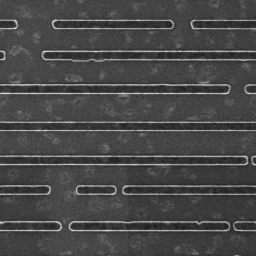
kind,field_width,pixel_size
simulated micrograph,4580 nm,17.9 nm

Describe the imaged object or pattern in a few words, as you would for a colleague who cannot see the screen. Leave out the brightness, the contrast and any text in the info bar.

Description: parallel lines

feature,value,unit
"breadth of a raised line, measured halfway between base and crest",156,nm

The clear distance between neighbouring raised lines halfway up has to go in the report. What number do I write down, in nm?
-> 456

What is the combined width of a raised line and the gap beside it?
604 nanometres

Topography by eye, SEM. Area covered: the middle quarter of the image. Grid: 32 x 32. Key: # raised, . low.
................................
................................
................................
................................
................................
################################
################################
................................
................................
................................
................................
................................
................................
................................
................................
################################
################################
................................
................................
................................
................................
................................
................................
################################
################################
................................
................................
................................
................................
................................
...........................#....
...##########..#################